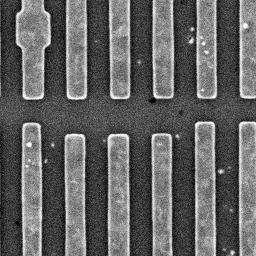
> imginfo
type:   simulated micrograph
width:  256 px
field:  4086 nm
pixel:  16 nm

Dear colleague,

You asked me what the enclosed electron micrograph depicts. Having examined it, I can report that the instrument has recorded wiring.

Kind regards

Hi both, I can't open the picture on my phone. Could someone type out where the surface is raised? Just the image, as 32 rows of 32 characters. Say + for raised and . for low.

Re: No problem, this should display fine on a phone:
...++...+++...++...+++...++...++
..++++..+++...++...++....++...++
..++++..+++...++...+++...++...++
..++++..+++...++...+++...++...++
..++++..+++...++...+++...++...++
..++++..+++...++...+++...++...++
...+++..+++...++...+++...++...++
...++...+++...++...+++...++...++
...++...+++...++...+++...++...++
...++...+++...++...+++...++...++
...++...+++...++...+++...++...++
...++...+++...++...+++...++...++
................................
................................
................................
...++....................++...++
...++...................+++...++
...++...++....++...++...+++...++
...++...+++...++...++...+++...++
...++...+++...++...++...+++...++
...++...++....++...++...+++...++
...++...++....++...++...+++...++
...++...++....++...++...+++...++
...++...++....++...++...+++...++
...++...++....++...++...+++...++
...++...++....++...++...+++...++
...++...++....++...++...+++...++
...++...+++...++...++...+++...++
...++...+++...++...++...+++...++
...++...+++...++...++...+++...++
...++...+++...++...++...+++...++
...++...+++...++...++...+++...++